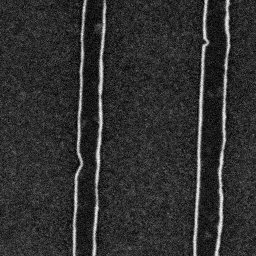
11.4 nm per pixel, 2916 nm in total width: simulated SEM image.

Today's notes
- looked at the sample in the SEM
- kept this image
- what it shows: one or a few lines or trenches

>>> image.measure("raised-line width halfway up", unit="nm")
258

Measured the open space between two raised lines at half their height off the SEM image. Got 1140 nm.